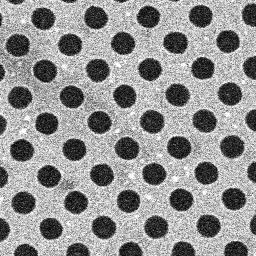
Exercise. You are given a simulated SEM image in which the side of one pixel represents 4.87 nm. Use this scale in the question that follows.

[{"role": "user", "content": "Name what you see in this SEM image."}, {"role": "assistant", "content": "a regular array of holes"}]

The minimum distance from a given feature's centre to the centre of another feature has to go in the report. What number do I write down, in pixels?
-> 36.6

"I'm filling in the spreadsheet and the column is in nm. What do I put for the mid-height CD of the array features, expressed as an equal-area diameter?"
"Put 114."